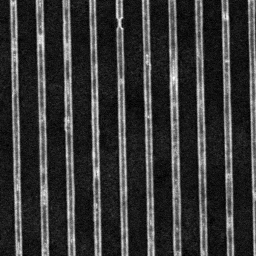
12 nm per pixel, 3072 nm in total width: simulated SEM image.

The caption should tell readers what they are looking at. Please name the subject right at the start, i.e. parallel lines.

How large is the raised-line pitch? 0.317 microns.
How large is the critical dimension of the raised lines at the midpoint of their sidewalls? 0.0705 microns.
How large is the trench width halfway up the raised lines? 252 nm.